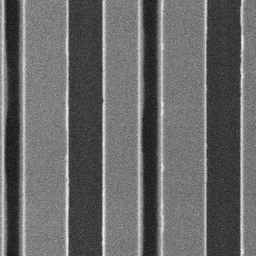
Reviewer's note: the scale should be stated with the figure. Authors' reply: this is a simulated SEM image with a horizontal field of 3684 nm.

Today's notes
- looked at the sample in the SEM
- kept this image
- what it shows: lines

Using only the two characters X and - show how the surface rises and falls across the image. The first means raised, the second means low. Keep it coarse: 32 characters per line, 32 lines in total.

---XXXXX-----XXXX---XXXXXX----XX
---XXXXX-----XXXX---XXXXXX----XX
---XXXXX-----XXXX---XXXXXX----XX
---XXXXX-----XXXX---XXXXXX----XX
---XXXXX-----XXXXX--XXXXXX----XX
---XXXXX-----XXXXX--XXXXXX----XX
---XXXXX-----XXXX---XXXXXX----XX
---XXXXX-----XXXX---XXXXXX----XX
---XXXXX-----XXXX---XXXXXX----XX
---XXXXX-----XXXX---XXXXXX----XX
---XXXXX-----XXXXX--XXXXXX----XX
---XXXXX-----XXXXX--XXXXXX----XX
---XXXXX-----XXXXX--XXXXXX----XX
---XXXXX-----XXXXX--XXXXXX----XX
---XXXXX-----XXXX---XXXXXX----XX
---XXXXX-----XXXX---XXXXXX----XX
---XXXXX-----XXXX---XXXXXX----XX
---XXXXX-----XXXX---XXXXXX----XX
---XXXXX-----XXXX---XXXXXX----XX
---XXXXX-----XXXXX--XXXXXX----XX
---XXXXX-----XXXXX--XXXXXX----XX
---XXXXX-----XXXXX--XXXXXX----XX
---XXXXX-----XXXX---XXXXXX----XX
---XXXXX-----XXXX---XXXXXX----XX
---XXXXX-----XXXX---XXXXXX----XX
---XXXXX-----XXXX---XXXXXX----XX
---XXXXX-----XXXX---XXXXXX----XX
---XXXXX-----XXXXX--XXXXXX----XX
---XXXXX-----XXXXX--XXXXXX----XX
---XXXXX-----XXXX---XXXXXX----XX
---XXXXX-----XXXX---XXXXXX----XX
---XXXXX-----XXXX---XXXXXX----XX